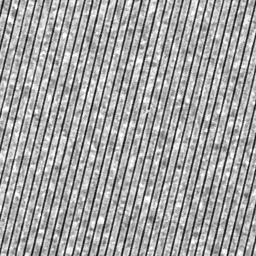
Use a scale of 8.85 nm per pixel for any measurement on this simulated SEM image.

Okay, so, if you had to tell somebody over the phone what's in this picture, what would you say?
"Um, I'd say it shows parallel lines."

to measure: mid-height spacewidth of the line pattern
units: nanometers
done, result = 24.8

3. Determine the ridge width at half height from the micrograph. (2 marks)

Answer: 0.0505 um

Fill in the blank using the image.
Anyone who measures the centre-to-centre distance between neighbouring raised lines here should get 70.1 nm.